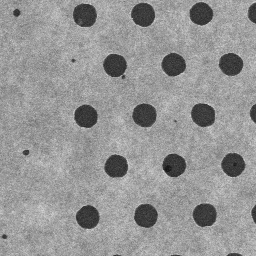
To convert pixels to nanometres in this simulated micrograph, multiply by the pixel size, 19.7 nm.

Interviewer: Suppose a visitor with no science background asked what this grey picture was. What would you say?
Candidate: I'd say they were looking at a regular array of holes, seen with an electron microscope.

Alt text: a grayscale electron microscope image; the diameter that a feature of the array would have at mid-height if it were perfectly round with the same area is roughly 468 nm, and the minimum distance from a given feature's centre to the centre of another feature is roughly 1140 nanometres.